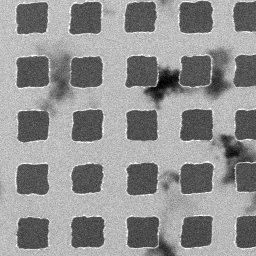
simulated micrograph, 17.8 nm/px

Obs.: a regular array of raised bodies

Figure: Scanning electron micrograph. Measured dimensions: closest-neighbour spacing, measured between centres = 953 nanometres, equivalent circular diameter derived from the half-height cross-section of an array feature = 634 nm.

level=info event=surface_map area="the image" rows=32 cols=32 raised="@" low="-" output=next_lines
--@@@@---@@@@---@@@----@@@---@@@
--@@@@---@@@@---@@@@--@@@@@--@@@
--@@@@---@@@@---@@@@--@@@@@--@@@
--@@@@---@@@@---@@@---@@@@@--@@@
--------------------------------
--------------------------------
--------------------------------
--@@@@---@@@@---@@@@---@@@---@@@
--@@@@---@@@@---@@@@---@@@---@@@
--@@@@---@@@@---@@@@--@@@@---@@@
--@@@@---@@@@---@@@----@@@---@@@
--------------------------------
--------------------------------
--------------------------------
--@@@@---@@@@---@@@@---@@@@--@@@
--@@@@---@@@@---@@@@---@@@@--@@@
--@@@@---@@@@---@@@@--@@@@@--@@@
--@@@@---@@@----@@@----@@@----@-
--------------------------------
--------------------------------
---@-@-----@----@@@----@@@----@@
--@@@@---@@@@---@@@@---@@@@--@@@
--@@@@---@@@@---@@@@--@@@@@--@@@
--@@@@---@@@@---@@@@---@@@@---@@
--------------------------------
--------------------------------
--------------------------------
--@@@@---@@@@---@@@@---@@@@---@@
--@@@@---@@@@---@@@@---@@@@--@@@
--@@@@---@@@@---@@@@---@@@---@@@
--@@@@---@@@@---@@@@---@@@---@@@
--------------------------------